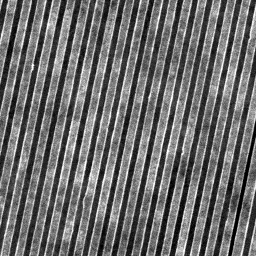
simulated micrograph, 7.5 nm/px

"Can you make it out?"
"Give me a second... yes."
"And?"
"parallel lines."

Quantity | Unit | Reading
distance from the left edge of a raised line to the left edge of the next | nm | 107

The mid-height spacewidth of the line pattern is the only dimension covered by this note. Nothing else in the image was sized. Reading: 45.9 nm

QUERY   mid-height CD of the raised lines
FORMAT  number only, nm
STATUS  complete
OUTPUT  59.7